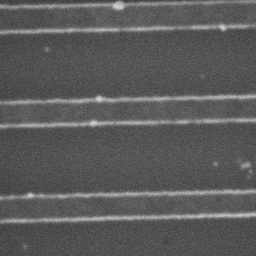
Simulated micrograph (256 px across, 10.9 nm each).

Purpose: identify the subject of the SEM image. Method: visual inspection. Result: lines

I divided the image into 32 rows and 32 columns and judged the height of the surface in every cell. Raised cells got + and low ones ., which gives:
..............++++++++++++++++++
++++++++++++++++++++++++++++++++
++++++++++++++++++++++++++++++++
++++++++++++++++++++++.....+....
................................
................................
................................
................................
................................
................................
................................
................................
.......+..++++++++++++++++++++++
++++++++++++++++++++++++++++++++
++++++++++++++++++++++++++++++++
++++++++++++....................
................................
................................
................................
................................
................................
................................
................................
................................
...+....++++++++++++++++++++++++
++++++++++++++++++++++++++++++++
++++++++++++++++++++++++++++++++
++++++++........................
................................
................................
................................
................................